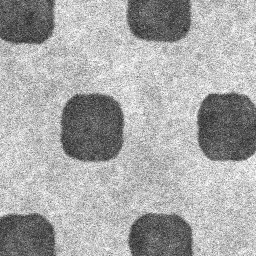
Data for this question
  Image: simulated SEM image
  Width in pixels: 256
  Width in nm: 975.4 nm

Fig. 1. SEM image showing holes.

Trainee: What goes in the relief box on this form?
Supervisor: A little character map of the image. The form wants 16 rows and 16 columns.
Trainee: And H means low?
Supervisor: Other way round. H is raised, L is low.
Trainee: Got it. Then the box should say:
LLLHHHHHLLLLHHHH
LLLHHHHHLLLLHHHH
LLLHHHHHHLLHHHHH
HHHHHHHHHHHHHHHH
HHHHHHHHHHHHHHHH
HHHHHHHHHHHHHHHH
HHHHLLLHHHHHHLLL
HHHHLLLLHHHHLLLL
HHHHLLLLHHHHLLLL
HHHHLLLHHHHHHLLL
HHHHHHHHHHHHHHHH
HHHHHHHHHHHHHHHH
HHHHHHHHHHHHHHHH
LLLHHHHHHLLHHHHH
LLLHHHHHLLLLHHHH
LLLHHHHHLLLLHHHH